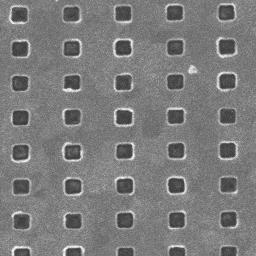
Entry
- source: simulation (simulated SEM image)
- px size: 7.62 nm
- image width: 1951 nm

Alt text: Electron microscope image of a regular array of holes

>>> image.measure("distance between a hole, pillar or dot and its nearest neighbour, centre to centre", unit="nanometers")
262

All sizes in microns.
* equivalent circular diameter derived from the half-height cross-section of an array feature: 0.133